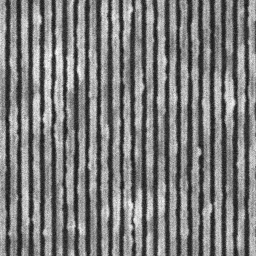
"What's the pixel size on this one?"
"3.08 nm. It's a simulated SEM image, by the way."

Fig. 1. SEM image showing parallel lines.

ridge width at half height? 21.6 nm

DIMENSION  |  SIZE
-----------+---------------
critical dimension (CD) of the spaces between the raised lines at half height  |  13.9 nm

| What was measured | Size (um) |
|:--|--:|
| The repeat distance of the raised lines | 0.035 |